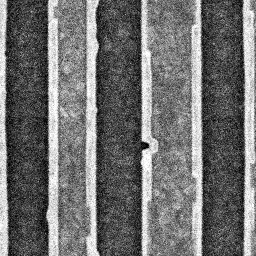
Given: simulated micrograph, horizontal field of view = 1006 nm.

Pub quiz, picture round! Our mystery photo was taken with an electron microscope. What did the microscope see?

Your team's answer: one or a few lines or trenches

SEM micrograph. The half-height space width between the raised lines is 0.185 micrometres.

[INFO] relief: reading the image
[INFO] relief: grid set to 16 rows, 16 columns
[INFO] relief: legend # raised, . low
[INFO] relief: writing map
...###...###...#
...###...###...#
...###...###...#
...###...###...#
...###...###...#
...###...###...#
...###...###...#
...###...###...#
...###...###...#
...###...###....
...###...###....
...###...###....
...###...###...#
...###...###....
...###...###....
...###...###....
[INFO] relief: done